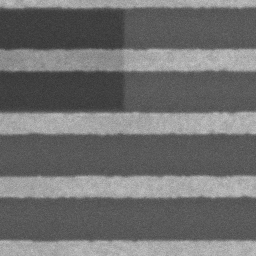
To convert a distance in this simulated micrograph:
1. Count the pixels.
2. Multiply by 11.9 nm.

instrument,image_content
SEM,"lines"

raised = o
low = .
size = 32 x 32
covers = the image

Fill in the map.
oooooooooooooooooooooooooooooooo
................................
................................
................................
................................
................................
oooooooooooooooooooooooooooooooo
oooooooooooooooooooooooooooooooo
oooooooooooooooooooooooooooooooo
................................
................................
................................
................................
................................
oooooooooooooooooooooooooooooooo
oooooooooooooooooooooooooooooooo
oooooooooooooooooooooooooooooooo
................................
................................
................................
................................
................................
oooooooooooooooooooooooooooooooo
oooooooooooooooooooooooooooooooo
oooooooooooooooooooooooooooooooo
................................
................................
................................
................................
................................
oooooooooooooooooooooooooooooooo
oooooooooooooooooooooooooooooooo